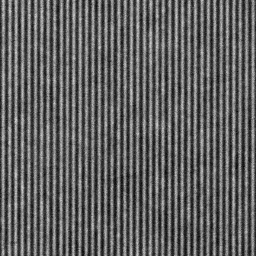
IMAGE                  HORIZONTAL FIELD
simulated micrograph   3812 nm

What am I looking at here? parallel lines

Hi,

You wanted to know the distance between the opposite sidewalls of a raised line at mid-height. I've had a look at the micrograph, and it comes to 29.8 nm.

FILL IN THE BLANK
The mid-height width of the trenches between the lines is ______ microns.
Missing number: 0.067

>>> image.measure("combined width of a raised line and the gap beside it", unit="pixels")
6.41